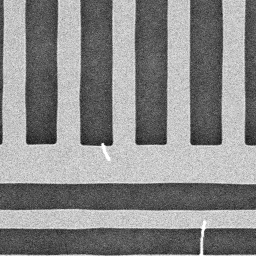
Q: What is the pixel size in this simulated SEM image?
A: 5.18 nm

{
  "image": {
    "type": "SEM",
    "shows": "groups of lines, slits or small figures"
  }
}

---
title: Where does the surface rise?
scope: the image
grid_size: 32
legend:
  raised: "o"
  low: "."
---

.oo....ooo....ooo....ooo....ooo.
.oo....ooo....ooo....ooo....ooo.
.oo....ooo....ooo....ooo....ooo.
.oo....ooo....ooo....ooo....ooo.
.oo....ooo....ooo....ooo....ooo.
.oo....ooo....ooo....ooo....ooo.
.oo....ooo....ooo....ooo....ooo.
.oo....ooo....ooo....ooo....ooo.
.oo....ooo....ooo....ooo....ooo.
.oo....ooo....ooo....ooo....ooo.
.oo....ooo....ooo....ooo....ooo.
ooo....ooo....ooo....ooo....ooo.
ooo....ooo....ooo....ooo....ooo.
ooo....ooo....ooo....ooo....ooo.
ooo....ooo....ooo....ooo....ooo.
ooo....ooo....ooo....ooo....ooo.
ooo....ooo....ooo....ooo....ooo.
ooo....ooo....ooo....ooo....ooo.
oooooooooooooooooooooooooooooooo
oooooooooooooooooooooooooooooooo
oooooooooooooooooooooooooooooooo
oooooooooooooooooooooooooooooooo
oooooooooooooooooooooooooooooooo
................................
................................
................................
oooooooooooooooooooooooooooooooo
oooooooooooooooooooooooooooooooo
oooooooooooo...ooooooooooooo..oo
................................
................................
................................